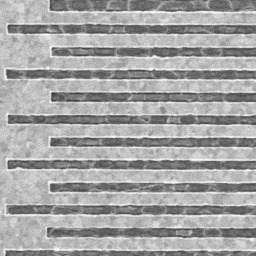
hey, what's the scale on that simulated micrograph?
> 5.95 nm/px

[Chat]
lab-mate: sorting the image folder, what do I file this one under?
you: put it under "parallel lines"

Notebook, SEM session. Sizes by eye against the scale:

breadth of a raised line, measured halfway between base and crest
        72.8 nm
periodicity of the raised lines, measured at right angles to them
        0.134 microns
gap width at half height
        62.4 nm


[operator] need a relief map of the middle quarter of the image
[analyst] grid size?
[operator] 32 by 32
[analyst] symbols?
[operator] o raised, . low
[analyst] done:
oooooooooooooooooooooooooooooooo
................................
..................oo............
................................
oooooooooooooooooooooooooooooooo
oooooooooooooooooooooooooooooooo
oooooooooooooooooooooooooooooooo
................................
.......................o....ooo.
................................
oooooooooooooooooooooooooooooooo
oooooooooooooooooooooooooooooooo
ooo.ooooooo.oo.oooooooooo.ooooo.
................................
................................
oooooooooooooooooooooooooooooooo
oooooooooooooooooooooooooooooooo
oooooooooooooooooooooooooooooooo
................................
................................
................................
oooooooooooooooooooooooooooooooo
oooooooooooooooooooooooooooooooo
oooooooooooooooooooooooooooooooo
................................
................................
ooooooooooooo...................
oooooooooooooooooooooooooooooooo
oooooooooooooooooooooooooooooooo
oo...ooooooo.oo..ooooooooooooooo
................................
................................